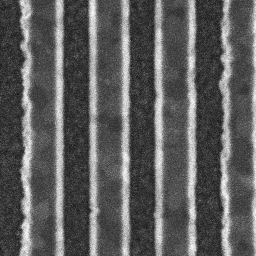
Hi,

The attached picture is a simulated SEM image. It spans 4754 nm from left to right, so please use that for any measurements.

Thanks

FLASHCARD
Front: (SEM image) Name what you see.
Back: one or a few lines or trenches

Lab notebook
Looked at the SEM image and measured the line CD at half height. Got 33.7 px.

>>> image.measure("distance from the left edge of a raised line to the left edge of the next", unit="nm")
1230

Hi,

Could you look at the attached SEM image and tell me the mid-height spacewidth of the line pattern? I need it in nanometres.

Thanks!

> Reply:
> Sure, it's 610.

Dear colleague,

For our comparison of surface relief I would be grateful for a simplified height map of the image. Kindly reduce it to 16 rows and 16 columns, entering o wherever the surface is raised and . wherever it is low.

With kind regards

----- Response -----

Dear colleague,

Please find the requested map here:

..oo..oo..oo..oo
..oo..oo..oo..oo
..oo..oo..oo..oo
..oo..oo..oo..oo
..oo..oo..oo..oo
..oo..oo..oo..oo
..oo..oo..oo..oo
..oo..oo..oo..oo
..oo..oo..oo..oo
..oo..oo..oo..oo
..oo..oo..oo..oo
..oo..oo..oo..oo
..oo..oo..oo..oo
..oo..oo..oo..oo
..oo..oo..oo..oo
..oo..oo..oo..oo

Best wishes